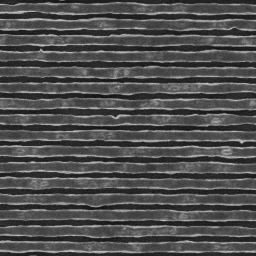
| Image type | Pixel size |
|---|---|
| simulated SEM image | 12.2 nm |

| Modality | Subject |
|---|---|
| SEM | parallel lines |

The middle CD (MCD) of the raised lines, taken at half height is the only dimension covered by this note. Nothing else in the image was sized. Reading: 119 nanometres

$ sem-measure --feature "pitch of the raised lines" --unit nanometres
195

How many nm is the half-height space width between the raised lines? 76.5